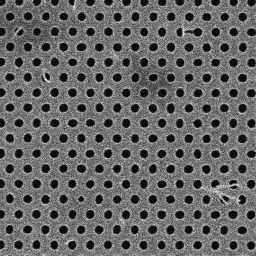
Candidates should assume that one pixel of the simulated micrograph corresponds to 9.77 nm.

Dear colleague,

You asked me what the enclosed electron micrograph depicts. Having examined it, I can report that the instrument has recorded a regular array of holes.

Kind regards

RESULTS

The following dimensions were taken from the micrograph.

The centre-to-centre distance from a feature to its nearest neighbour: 170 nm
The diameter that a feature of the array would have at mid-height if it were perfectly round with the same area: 0.0839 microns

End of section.